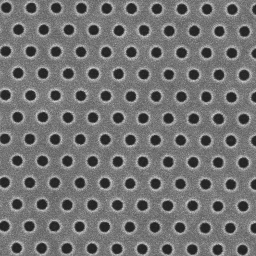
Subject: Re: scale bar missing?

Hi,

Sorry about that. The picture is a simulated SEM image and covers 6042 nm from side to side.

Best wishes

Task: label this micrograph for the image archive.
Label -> a regular array of holes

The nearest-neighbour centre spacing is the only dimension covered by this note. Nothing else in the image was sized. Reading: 24.9 pixels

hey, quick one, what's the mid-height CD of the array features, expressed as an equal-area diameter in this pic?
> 261 nanometers